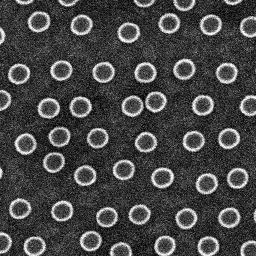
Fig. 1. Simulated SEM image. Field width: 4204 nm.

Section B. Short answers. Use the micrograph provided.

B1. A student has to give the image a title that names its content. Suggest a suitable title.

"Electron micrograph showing a regular array of raised bodies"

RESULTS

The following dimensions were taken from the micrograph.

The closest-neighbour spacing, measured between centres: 35.1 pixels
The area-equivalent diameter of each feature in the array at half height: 0.319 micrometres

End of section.